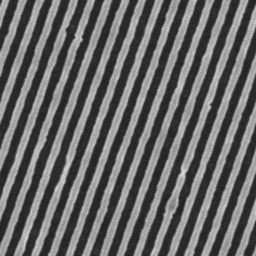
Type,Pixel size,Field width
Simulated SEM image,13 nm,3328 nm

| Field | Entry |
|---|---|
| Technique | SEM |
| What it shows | parallel lines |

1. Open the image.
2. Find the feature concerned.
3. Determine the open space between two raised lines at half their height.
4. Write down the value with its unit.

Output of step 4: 0.119 um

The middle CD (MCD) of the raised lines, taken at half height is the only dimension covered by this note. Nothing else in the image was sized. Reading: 0.0843 micrometres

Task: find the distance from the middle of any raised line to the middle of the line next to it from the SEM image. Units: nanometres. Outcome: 209